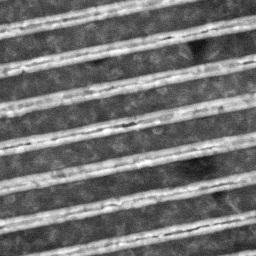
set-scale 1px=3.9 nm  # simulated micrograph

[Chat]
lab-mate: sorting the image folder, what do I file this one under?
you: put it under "parallel lines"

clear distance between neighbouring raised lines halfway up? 0.112 microns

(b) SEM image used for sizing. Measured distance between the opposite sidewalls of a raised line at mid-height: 40.2 nm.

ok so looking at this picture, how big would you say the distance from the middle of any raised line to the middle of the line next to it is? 149 nm